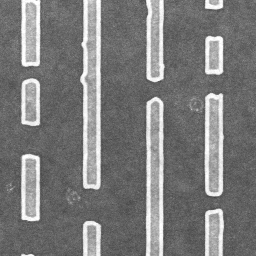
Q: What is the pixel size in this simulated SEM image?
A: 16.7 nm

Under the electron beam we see one or a few lines or trenches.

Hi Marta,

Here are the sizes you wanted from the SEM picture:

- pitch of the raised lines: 1020 nanometers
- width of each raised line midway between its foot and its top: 208 nm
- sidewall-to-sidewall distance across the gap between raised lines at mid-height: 0.796 µm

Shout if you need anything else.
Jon